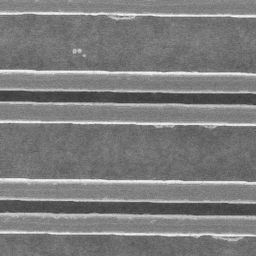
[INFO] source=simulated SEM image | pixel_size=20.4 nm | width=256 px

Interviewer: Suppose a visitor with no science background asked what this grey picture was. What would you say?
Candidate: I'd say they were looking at lines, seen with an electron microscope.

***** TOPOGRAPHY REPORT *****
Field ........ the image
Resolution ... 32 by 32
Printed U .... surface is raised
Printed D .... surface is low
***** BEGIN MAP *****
UUUUUUUUUUUUUUUUUUUUUUUUUUUUUUUU
UUUUUUUUUUUUUUUUUUUUUUUUUUUUUUUU
DDDDDDDDDDDDDDDDDDDDDDDDDDDDDDDD
DDDDDDDDDDDDDDDDDDDDDDDDDDDDDDDD
DDDDDDDDDDDDDDDDDDDDDDDDDDDDDDDD
DDDDDDDDDDDDDDDDDDDDDDDDDDDDDDDD
DDDDDDDDDDDDDDDDDDDDDDDDDDDDDDDD
DDDDDDDDDDDDDDDDDDDDDDDDDDDDDDDD
DDDDDDDDDDDDDDDDDDDDDDDDDDDDDDDD
UUUUUUUUUUUUUUUUUUUUUUUUUUUUUUUU
UUUUUUUUUUUUUUUUUUUUUUUUUUUUUUUU
DDDDDDDDDDDDDDDDDDDDDUUUUUUUUUUU
DDDDDDDDDDDDDDDDDDDDDDDDDDDDDDDD
UUUUUUUUUUUUUUUUUUUUUUUUUUUUUUUU
UUUUUUUUUUUUUUUUUUUUUUUUUUUUUUUU
DDDDDDDDDDDDDDDDDUUUUUUUUUUUUUUU
DDDDDDDDDDDDDDDDDDDDDDDDDDDDDDDD
DDDDDDDDDDDDDDDDDDDDDDDDDDDDDDDD
DDDDDDDDDDDDDDDDDDDDDDDDDDDDDDDD
DDDDDDDDDDDDDDDDDDDDDDDDDDDDDDDD
DDDDDDDDDDDDDDDDDDDDDDDDDDDDDDDD
DDDDDDDDDDDDDDDDDDDDDDDDDDDDDDDD
UUUUUUUUUUUDDDDDDDDDDDDDDDDDDDDD
UUUUUUUUUUUUUUUUUUUUUUUUUUUUUUUU
UUUUUUUUUUUUUUUUUUUUUUUUUUUUUUUU
DDDDDDDDDDDDDDDDDDDDDDDDDDDDDDDD
DDDDDDDDDDDDDDDDDDDDDDDDDDDDDDDD
UUUUUUUUUUUUUUUUUUUUUUUUUUUUUUUU
UUUUUUUUUUUUUUUUUUUUUUUUUUUUUUUU
DDDDDDDDDDDDDDDDDDDDDDDDDDDDDDDD
DDDDDDDDDDDDDDDDDDDDDDDDDDDDDDDD
DDDDDDDDDDDDDDDDDDDDDDDDDDDDDDDD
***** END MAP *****